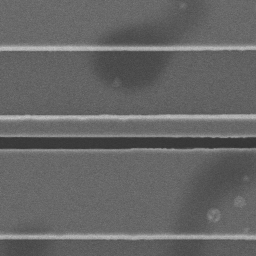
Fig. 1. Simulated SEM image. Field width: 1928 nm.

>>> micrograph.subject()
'lines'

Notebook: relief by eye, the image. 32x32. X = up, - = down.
XXXXXXXXXXXXXXXXXXXXXXXXXXXXXXXX
XXXXXXXXXXXXXXXXXXXXXXXXXXXXXXXX
XXXXXXXXXXXXXXXXXXXXXXXXXXXXXXXX
XXXXXXXXXXXXXXXXXXXXXXXXXXXXXXXX
XXXXXXXXXXXXXXXXXXXXXXXXXXXXXXXX
XXXXXXXXXXXXXXXXXXXXXXXXXXXXXXXX
--------------------------------
--------------------------------
--------------------------------
--------------------------------
--------------------------------
--------------------------------
--------------------------------
--------------------------------
--------------------------------
XXXXXXXXXXXXXXXXXXXXXXXXXXXXXXXX
XXXXXXXXXXXXXXXXXXXXXXXXXXXXXXXX
--------------------------------
--------------------------------
XXXXXXXXXXXXXXXXXXXXXXXXXXXXXXXX
XXXXXXXXXXXXXXXXXXXXXXXXXXXXXXXX
XXXXXXXXXXXXXXXXXXXXXXXXXXXXXXXX
XXXXXXXXXXXXXXXXXXXXXXXXXXXXXXXX
XXXXXXXXXXXXXXXXXXXXXXXXXXXXXXXX
XXXXXXXXXXXXXXXXXXXXXXXXXXXXXXXX
XXXXXXXXXXXXXXXXXXXXXXXXXXXXXXXX
XXXXXXXXXXXXXXXXXXXXXXXXXXXXXXXX
XXXXXXXXXXXXXXXXXXXXXXXXXXXXXXXX
XXXXXXXXXXXXXXXXXXXXXXXXXXXXXXXX
XXXXXXXXXXXXXXXXXXXXXXXXXXXXXXXX
--------------------------------
--------------------------------